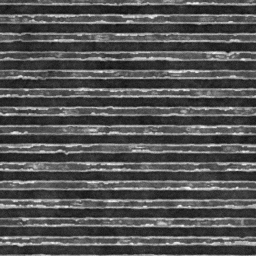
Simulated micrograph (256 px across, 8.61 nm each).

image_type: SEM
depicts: parallel lines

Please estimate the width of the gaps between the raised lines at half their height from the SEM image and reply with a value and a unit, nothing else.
86.1 nm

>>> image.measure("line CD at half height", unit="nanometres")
70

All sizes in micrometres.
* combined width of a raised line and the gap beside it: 0.159